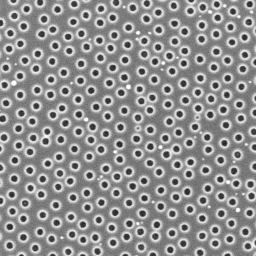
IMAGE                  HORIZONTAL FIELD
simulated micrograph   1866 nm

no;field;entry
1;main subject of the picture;a regular array of holes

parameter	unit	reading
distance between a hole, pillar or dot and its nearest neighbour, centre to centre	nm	103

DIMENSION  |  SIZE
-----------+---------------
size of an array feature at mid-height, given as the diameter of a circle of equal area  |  52 nanometers